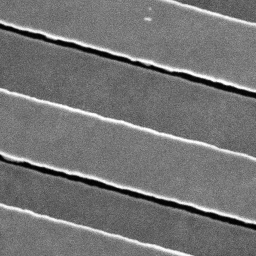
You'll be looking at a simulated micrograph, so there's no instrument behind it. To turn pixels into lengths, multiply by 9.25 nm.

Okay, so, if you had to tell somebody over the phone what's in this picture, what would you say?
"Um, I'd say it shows lines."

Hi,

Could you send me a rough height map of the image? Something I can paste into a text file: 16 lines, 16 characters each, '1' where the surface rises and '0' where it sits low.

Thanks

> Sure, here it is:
1111111111110000
1111111111111111
0000111111111111
0000000011111111
0000000000011111
0000000000000001
1111000000000000
1111111000000000
1111111111100000
1111111111111110
0001111111111111
0000000111111111
0000000000011111
1110000000000011
1111111000000000
1111111111000000